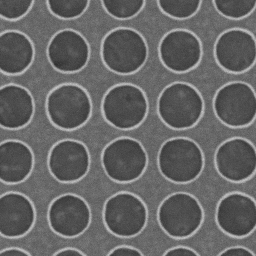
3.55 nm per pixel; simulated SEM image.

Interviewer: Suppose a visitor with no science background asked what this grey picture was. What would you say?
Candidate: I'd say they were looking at a regular array of holes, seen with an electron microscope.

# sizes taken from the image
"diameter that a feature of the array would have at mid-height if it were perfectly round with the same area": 156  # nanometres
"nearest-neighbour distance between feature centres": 194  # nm